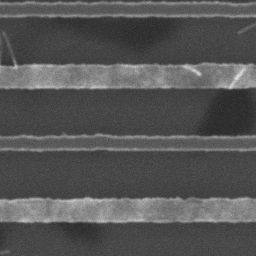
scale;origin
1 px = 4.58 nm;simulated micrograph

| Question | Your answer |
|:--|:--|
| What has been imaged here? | lines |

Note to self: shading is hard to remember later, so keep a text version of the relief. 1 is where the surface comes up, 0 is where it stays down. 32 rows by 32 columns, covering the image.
11111111111111111111111111111111
11111111111111111111111111111111
00000000000000000000000000000000
00000000000000000000000000000000
00000000000000000000000000000000
00000000000000000000000000000000
00000000000000000000000000000000
00000000000000000000000000000000
11111111111111111111111111111111
11111111111111111111111111111111
11111111111111111111111111111111
00000000000000000000000000000000
00000000000000000000000000000000
00000000000000000000000000000000
00000000000000000000000000000000
00000000000000000000000000000000
00000000000000000000000000000000
11111111111111111111111111111111
11111111111111111111111111111111
00000000000000000000000000000000
00000000000000000000000000000000
00000000000000000000000000000000
00000000000000000000000000000000
00000000000000000000000000000000
00000000000000000000000000000000
11111111111111111111111111111111
11111111111111111111111111111111
11111111111111111111111111111111
00000000000000000000000000000000
00000000000000000000000000000000
00000000000000000000000000000000
00000000000000000000000000000000